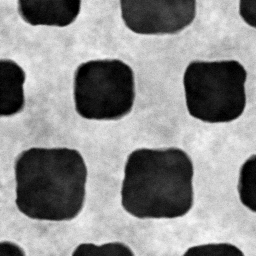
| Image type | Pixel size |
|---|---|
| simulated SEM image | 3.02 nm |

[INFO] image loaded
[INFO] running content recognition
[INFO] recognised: holes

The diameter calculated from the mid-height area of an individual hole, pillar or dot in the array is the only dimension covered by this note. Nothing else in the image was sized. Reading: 213 nm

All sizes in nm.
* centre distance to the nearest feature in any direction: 325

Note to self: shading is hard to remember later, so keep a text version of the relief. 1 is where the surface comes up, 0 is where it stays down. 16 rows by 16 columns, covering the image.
1000011100001110
1100111100001111
1111111111111111
1111111111111111
0111100011110001
0111100011110001
0111100011110001
1111111111111001
1111111111111111
1100011100011111
1000011100001110
1000011100001110
1000011100001110
1100011100011111
1111111111111111
0111100011110001